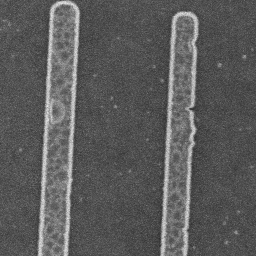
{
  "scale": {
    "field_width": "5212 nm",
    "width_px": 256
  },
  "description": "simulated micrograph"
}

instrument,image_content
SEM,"one or a few lines or trenches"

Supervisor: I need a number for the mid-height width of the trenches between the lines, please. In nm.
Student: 1980